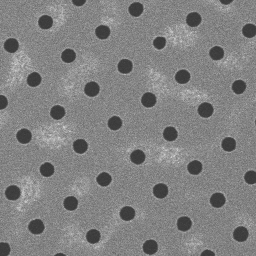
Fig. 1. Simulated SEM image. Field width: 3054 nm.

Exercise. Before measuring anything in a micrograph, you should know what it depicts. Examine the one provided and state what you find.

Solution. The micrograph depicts a regular array of holes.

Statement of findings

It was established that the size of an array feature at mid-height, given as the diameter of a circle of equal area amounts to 182 nanometres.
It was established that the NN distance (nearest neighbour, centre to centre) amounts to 481 nm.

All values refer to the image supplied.